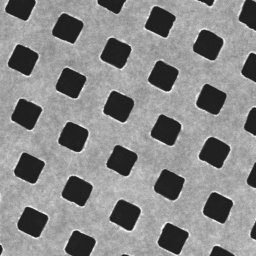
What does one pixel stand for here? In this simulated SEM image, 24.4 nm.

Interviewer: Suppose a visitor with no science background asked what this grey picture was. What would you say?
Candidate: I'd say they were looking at a regular array of holes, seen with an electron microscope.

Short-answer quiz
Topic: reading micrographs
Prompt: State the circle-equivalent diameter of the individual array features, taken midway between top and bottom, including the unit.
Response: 690 nm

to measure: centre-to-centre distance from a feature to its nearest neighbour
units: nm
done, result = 1300